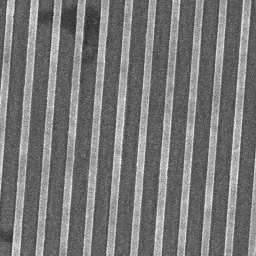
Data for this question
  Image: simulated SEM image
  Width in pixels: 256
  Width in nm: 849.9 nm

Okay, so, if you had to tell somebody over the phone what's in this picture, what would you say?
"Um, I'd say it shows parallel lines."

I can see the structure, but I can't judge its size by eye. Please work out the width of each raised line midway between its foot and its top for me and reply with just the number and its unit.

23.6 nm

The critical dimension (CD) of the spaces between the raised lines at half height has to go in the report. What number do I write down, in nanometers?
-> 55.5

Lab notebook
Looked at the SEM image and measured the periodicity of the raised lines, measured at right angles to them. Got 78.2 nanometres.